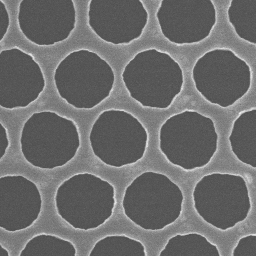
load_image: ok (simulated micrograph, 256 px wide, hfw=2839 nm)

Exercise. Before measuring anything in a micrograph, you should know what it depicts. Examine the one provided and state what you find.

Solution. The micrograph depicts a regular array of holes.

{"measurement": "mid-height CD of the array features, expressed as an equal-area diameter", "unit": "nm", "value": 635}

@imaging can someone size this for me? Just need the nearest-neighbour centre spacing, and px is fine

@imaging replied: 68.5